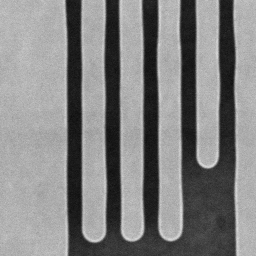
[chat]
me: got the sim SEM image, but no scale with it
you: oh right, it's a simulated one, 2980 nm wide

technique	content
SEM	groups of lines, slits or small figures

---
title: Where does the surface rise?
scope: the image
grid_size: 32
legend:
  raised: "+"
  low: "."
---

++++++++..+++..+++..++...++..+++
++++++++..+++..+++..++...++..+++
++++++++..+++..+++..++...++..+++
++++++++..+++..+++..++...++..+++
++++++++..+++..+++..++...++..+++
++++++++..+++..+++..++...++..+++
++++++++..+++..+++..+++..++..+++
++++++++..+++..+++..+++..++..+++
++++++++..+++..+++..+++..++..+++
++++++++..+++..+++..+++..++..+++
++++++++..+++..+++..+++..++..+++
++++++++..+++..+++..+++..++..+++
++++++++..+++..+++..+++..++..+++
++++++++..+++..+++..+++..++..+++
++++++++..+++..+++..+++..++..+++
++++++++..+++..+++..+++..++..+++
++++++++..+++..+++..+++..++..+++
++++++++..+++..+++..+++..++..+++
++++++++..+++..+++..+++..++...++
++++++++..+++..+++..+++..++...++
++++++++..+++..+++..+++..++...++
++++++++..+++..+++..+++......+++
++++++++..+++..+++..+++......+++
++++++++..+++..+++..+++......+++
++++++++..+++..+++..+++......+++
++++++++..+++..+++..+++......+++
++++++++..+++..+++..+++.......++
++++++++..+++..+++..+++.......++
++++++++..+++..+++..+++.......++
++++++++...++..+++..++........++
++++++++......................++
++++++++......................++